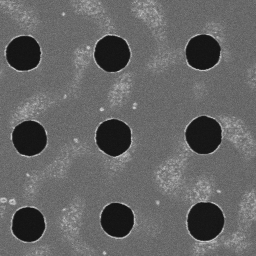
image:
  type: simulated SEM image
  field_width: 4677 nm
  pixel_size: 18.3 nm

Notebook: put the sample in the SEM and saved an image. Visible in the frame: a regular array of holes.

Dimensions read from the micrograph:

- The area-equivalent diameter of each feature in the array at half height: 0.647 micrometres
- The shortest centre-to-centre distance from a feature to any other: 1530 nm